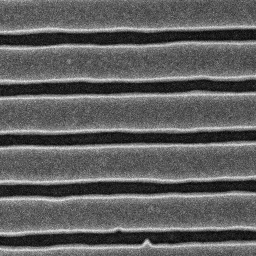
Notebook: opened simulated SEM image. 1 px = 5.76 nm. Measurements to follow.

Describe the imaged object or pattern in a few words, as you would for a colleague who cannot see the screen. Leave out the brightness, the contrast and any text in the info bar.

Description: parallel lines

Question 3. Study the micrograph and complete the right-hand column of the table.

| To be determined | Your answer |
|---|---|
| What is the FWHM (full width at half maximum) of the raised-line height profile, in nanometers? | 206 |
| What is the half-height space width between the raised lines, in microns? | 0.0849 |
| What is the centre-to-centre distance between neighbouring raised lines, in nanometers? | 290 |